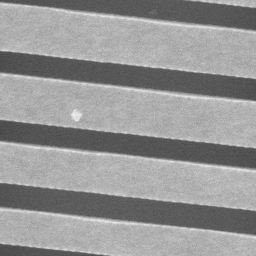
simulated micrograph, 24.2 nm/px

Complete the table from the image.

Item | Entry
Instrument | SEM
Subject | lines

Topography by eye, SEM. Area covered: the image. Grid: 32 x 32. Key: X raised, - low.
X---------------------------XXXX
XXXXXXXXXX----------------------
XXXXXXXXXXXXXXXXXXX-------------
XXXXXXXXXXXXXXXXXXXXXXXXXXXXX---
XXXXXXXXXXXXXXXXXXXXXXXXXXXXXXXX
XXXXXXXXXXXXXXXXXXXXXXXXXXXXXXXX
--XXXXXXXXXXXXXXXXXXXXXXXXXXXXXX
-----------XXXXXXXXXXXXXXXXXXXXX
--------------------XXXXXXXXXXXX
XXX--------------------------XXX
XXXXXXXXXXXX--------------------
XXXXXXXXXXXXXXXXXXXXX-----------
XXXXXXXXXXXXXXXXXXXXXXXXXXXXX---
XXXXXXXXXXXXXXXXXXXXXXXXXXXXXXXX
XXXXXXXXXXXXXXXXXXXXXXXXXXXXXXXX
------XXXXXXXXXXXXXXXXXXXXXXXXXX
--------------XXXXXXXXXXXXXXXXXX
-----------------------XXXXXXXXX
XXXXXXX-------------------------
XXXXXXXXXXXXXXXXX---------------
XXXXXXXXXXXXXXXXXXXXXXXXX-------
XXXXXXXXXXXXXXXXXXXXXXXXXXXXXXXX
XXXXXXXXXXXXXXXXXXXXXXXXXXXXXXXX
-------XXXXXXXXXXXXXXXXXXXXXXXXX
---------------XXXXXXXXXXXXXXXXX
-------------------------XXXXXXX
XXXXX---------------------------
XXXXXXXXXXXXXX------------------
XXXXXXXXXXXXXXXXXXXXXXX---------
XXXXXXXXXXXXXXXXXXXXXXXXXXXXXXXX
-XXXXXXXXXXXXXXXXXXXXXXXXXXXXXXX
----------XXXXXXXXXXXXXXXXXXXXXX